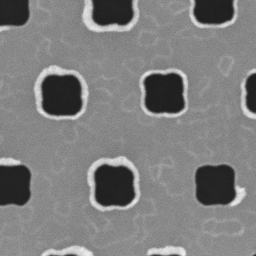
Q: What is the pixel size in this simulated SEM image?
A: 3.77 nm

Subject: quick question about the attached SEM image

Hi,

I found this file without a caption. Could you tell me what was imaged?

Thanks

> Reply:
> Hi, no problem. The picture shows holes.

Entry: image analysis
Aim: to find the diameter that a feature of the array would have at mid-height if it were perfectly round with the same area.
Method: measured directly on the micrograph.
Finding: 163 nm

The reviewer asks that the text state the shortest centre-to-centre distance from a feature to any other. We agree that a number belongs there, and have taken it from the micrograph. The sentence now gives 0.384 micrometres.